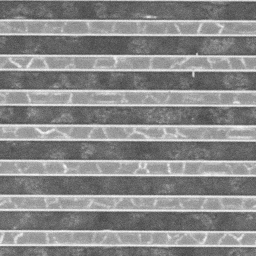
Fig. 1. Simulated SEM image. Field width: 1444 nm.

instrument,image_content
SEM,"parallel lines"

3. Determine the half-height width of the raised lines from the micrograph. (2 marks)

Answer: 80.3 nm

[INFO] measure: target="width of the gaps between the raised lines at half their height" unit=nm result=116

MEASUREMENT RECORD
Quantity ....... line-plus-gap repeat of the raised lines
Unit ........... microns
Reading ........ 0.198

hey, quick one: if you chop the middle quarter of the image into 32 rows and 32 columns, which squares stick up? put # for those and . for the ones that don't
################################
................................
................................
................................
................................
................................
................................
################################
################################
################################
................................
................................
................................
................................
................................
................................
################################
.###################.###########
################################
................................
................................
................................
................................
................................
################################
################################
################################
################################
................................
................................
................................
................................